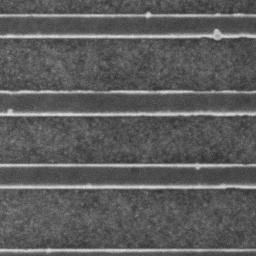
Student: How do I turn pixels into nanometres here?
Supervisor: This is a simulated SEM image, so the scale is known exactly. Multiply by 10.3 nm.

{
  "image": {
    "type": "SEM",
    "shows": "lines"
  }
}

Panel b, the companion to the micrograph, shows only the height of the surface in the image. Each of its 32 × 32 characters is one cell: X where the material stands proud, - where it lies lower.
--------------------------------
--------------------------------
XXXXXXXXXXXXXXXXXXXXXXXXXXXXXXXX
XXXXXXXXXXXXXXXXXXXXXXXXXXXXXXXX
XXXXXXXXXXXXXXXXXXXXXXXXXXXXXXXX
--------------------------------
--------------------------------
--------------------------------
--------------------------------
--------------------------------
--------------------------------
X-XX-XX--XXX--XXXX-XXXXXX--XXX-X
XXXXXXXXXXXXXXXXXXXXXXXXXXXXXXXX
XXXXXXXXXXXXXXXXXXXXXXXXXXXXXXXX
--------------------------------
--------------------------------
--------------------------------
--------------------------------
--------------------------------
--------------------------------
------------------------X-------
XXXXXXXXXXXXXXXXXXXXXXXXXXXXXXXX
XXXXXXXXXXXXXXXXXXXXXXXXXXXXXXXX
--------------------------------
--------------------------------
--------------------------------
--------------------------------
--------------------------------
--------------------------------
--------------------------------
--------------------------------
XXXXXXXXXXXXXXXXXXXXXXXXXXXXXXXX